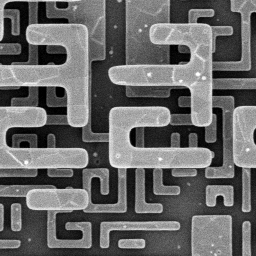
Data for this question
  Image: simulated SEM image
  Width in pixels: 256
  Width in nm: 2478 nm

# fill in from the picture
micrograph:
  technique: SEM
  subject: wiring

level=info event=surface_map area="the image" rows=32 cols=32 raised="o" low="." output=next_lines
o...............................
................................
................................
...oooooooo........ooooooo......
...oooooooo........ooooooo......
....ooooooo.........oooooo......
........ooo.............oo......
........ooo.............oo......
ooooooooooo...oooooooooooo......
ooooooooooo...oooooooooooo......
ooooooooooo....ooooooooooo......
........ooo.............oo......
.........oo.............oo......
ooooo....oo...ooooooo...oo....oo
oooooo...oo...ooooooo...oo...ooo
oooooo...oo...ooooooo...oo...ooo
o.............oo.............ooo
o.............oo.............ooo
oo............oooo.ooooooo...ooo
ooooooooooo...oooooooooooo...ooo
ooooooooooo...oooooooooooo....oo
................................
................................
................................
...oooooooo.....................
...oooooooo.....................
................................
................................
................................
................................
................................
................................